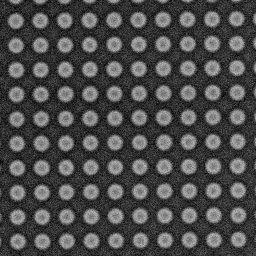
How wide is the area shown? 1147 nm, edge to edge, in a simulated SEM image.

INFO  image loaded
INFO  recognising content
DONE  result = an array of small figures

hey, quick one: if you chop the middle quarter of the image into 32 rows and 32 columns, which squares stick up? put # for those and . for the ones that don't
##...###...###...###...####..###
##...###...###...###...####..###
##...###...###...###....##....##
................................
................................
................................
##...###...###...###...###...###
##...###...###...####..####..###
##...###...###...###....##....##
................................
................................
................................
##...###...###...###...####...##
##...###...###...####..####..###
##...###...###...###....###...##
................................
................................
................................
##...###...###....##....###...##
##...###...###...####..####..###
##...###...###...###...####...##
#...............................
................................
................................
##....##....##....##....##....##
##...###...###...####..####..###
##...###...###...####..####...##
#.....##..........##............
................................
................................
##....##....##....##....##....##
##...###...####..####..####...##